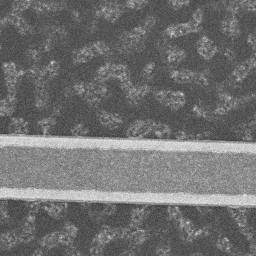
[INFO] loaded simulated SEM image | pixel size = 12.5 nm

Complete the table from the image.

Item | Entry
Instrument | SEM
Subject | one or a few lines or trenches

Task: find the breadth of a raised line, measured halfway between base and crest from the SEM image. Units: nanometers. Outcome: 673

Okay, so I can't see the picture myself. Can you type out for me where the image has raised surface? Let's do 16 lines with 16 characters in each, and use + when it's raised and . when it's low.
................
................
................
................
................
................
................
................
................
++++++++++++++++
++++++++++++++++
++++++++++++++++
............++++
................
................
................